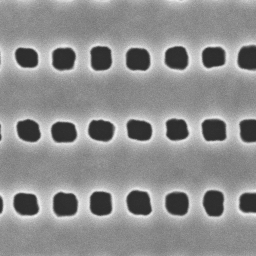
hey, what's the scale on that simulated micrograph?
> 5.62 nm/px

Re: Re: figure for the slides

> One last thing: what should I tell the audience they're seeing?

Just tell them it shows a regular array of holes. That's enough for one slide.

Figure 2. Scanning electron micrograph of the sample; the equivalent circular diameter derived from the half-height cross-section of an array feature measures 136 nm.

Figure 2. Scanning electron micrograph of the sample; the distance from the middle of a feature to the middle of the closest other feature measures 207 nm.